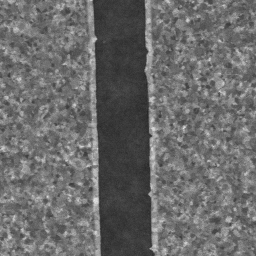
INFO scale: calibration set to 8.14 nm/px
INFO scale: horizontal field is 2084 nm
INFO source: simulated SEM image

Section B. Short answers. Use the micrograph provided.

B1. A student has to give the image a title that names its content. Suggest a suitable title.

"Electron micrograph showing one or a few lines or trenches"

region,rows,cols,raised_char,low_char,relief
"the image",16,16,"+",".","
++++++...+++++++
++++++...+++++++
++++++...+++++++
++++++...+++++++
++++++...+++++++
++++++...+++++++
++++++....++++++
++++++....++++++
++++++....++++++
++++++....++++++
++++++....++++++
++++++....++++++
++++++....++++++
++++++....++++++
++++++....++++++
++++++....++++++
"